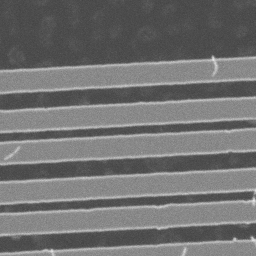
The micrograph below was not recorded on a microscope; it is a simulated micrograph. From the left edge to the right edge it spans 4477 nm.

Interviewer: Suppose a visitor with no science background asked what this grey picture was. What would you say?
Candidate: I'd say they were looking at parallel lines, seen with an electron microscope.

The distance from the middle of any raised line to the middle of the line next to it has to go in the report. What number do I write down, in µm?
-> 0.624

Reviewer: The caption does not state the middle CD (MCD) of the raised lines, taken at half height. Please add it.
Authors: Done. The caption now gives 391 nanometres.